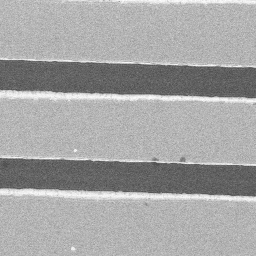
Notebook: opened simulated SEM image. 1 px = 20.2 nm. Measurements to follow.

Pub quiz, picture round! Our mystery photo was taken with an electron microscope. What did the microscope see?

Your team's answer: lines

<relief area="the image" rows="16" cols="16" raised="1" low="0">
1111111111111111
1111111111111111
1111111111111111
1111111111111111
0000000000000000
0000000000000000
1111111111111111
1111111111111111
1111111111111111
1111111111111111
0000000000000000
0000000000000000
1111111111111111
1111111111111111
1111111111111111
1111111111111111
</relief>